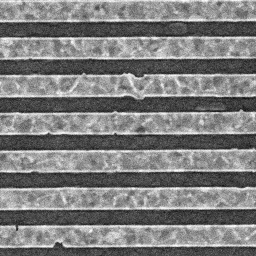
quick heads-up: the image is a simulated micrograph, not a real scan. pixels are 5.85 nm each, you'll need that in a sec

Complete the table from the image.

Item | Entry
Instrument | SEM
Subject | parallel lines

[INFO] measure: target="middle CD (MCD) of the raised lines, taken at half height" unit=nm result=116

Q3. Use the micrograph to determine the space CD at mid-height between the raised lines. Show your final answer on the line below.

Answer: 101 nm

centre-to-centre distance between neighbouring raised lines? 220 nm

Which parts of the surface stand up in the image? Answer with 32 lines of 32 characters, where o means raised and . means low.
oooooooooooooooooooooooooooooooo
oooooooooooooooooooooooooooooooo
ooooooooooooooooooo..........o..
................................
................................
oooooooooooooooooooooooooooooooo
oooooooooooooooooooooooooooooooo
................................
................................
..........o....oo..oo.oooooooooo
oooooooooooooooooooooooooooooooo
oooooooooooooooooooooooooooooooo
................................
................................
oooooooooooooooooooooooooooooooo
oooooooooooooooooooooooooooooooo
oooooooooooooooooooooooooooooooo
................................
................................
oooooooooooooooooooooooooooooooo
oooooooooooooooooooooooooooooooo
................................
................................
................................
oooooooooooooooooooooooooooooooo
oooooooooooooooooooooooooooooooo
................................
................................
oooooooooooooooooooooooooooooooo
oooooooooooooooooooooooooooooooo
ooooooo.oooooooooooooooooooooooo
................................